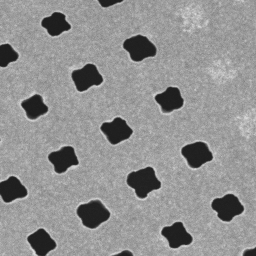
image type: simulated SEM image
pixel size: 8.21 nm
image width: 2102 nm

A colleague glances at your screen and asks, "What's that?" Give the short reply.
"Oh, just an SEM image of a regular array of holes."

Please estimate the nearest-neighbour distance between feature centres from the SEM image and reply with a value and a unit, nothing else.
0.49 µm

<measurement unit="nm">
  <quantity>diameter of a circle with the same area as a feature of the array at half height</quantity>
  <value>218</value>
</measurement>